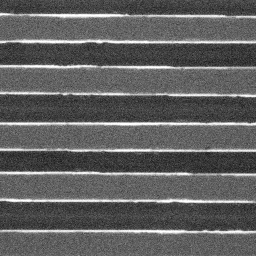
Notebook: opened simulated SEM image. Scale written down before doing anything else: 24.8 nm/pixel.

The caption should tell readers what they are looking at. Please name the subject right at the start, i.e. lines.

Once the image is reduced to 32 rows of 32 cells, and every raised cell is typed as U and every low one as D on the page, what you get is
DDDDDDDDDDDDDDDDDDDDDDDDDDDDDDDD
DDDDDDDDDDDDDDDDDDDDDDDDDDDDDDDD
UUUUUUUUUUUUUUUUUUUUUUUUUUUUUUUU
UUUUUUUUUUUUUUUUUUUUUUUUUUUUUUUU
UUUUUUUUUUUUUUUUUUUUUUUUUUUUUUUU
DDDDDDDDDDDDDDDDDDDDDDDDDDDDDDDD
DDDDDDDDDDDDDDDDDDDDDDDDDDDDDDDD
DDDDDDDDDDDDDDDDDDDDDDDDDDDDDDDD
UUUUUUUUUUUUUUUUUUUUUUUUUUUUUUUU
UUUUUUUUUUUUUUUUUUUUUUUUUUUUUUUU
UUUUUUUUUUUUUUUUUUUUUUUUUUUUUUUU
UUUUUUUUUUUUUUUUUUUUUUUUUUUUUUUU
DDDDDDDDDDDDDDDDDDDDDDDDDDDDDDDD
DDDDDDDDDDDDDDDDDDDDDDDDDDDDDDDD
DDDDDDDDDDDDDDDDDDDDDDDDDDDDDDDD
UUUUUUUUUUUUUUDUUUUUUUDDDDDDDDDD
UUUUUUUUUUUUUUUUUUUUUUUUUUUUUUUU
UUUUUUUUUUUUUUUUUUUUUUUUUUUUUUUU
UUUUUUUUUUUUUUUUUUUUUUUUUUUUUUUU
DDDDDDDDDDDDDDDDDDDDDDDDDDDDDDDD
DDDDDDDDDDDDDDDDDDDDDDDDDDDDDDDD
DDDDDDDDDDDDDDDDDDDDDDDDDDDDDDDD
UUUUUUUUUUUUUUUUUUUUUUUUUUUUUUUU
UUUUUUUUUUUUUUUUUUUUUUUUUUUUUUUU
UUUUUUUUUUUUUUUUUUUUUUUUUUUUUUUU
DDDDDDDDDDDDDDDDDDDDDDDDDDDDDDDD
DDDDDDDDDDDDDDDDDDDDDDDDDDDDDDDD
DDDDDDDDDDDDDDDDDDDDDDDDDDDDDDDD
DDDDDDDDDDDDDDDDDDDDDDDDDDDDDDDD
UUUUUUUUUUUUUUUUUUUUUUUUUUUUUUUU
UUUUUUUUUUUUUUUUUUUUUUUUUUUUUUUU
UUUUUUUUUUUUUUUUUUUUUUUUUUUUUUUU